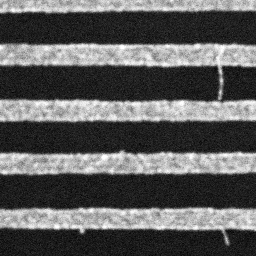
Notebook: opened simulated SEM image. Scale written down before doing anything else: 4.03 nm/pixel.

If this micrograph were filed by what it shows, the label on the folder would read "lines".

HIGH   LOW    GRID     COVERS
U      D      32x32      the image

UUUUUUUUUUUUUUUUUUUUUUUUUUUUUUUU
DDDDDDDDDDDDDDDDDDDDDDDDDDDDDDDD
DDDDDDDDDDDDDDDDDDDDDDDDDDDDDDDD
DDDDDDDDDDDDDDDDDDDDDDDDDDDDDDDD
DDDDDDDDDDDDDDDDDDDDDDDDDDDDDDDD
DDDDDDDDDDDDDDDDDDDDDDDDDDDDDDDD
UUUUUUUUUUUUUUUUUUUUUUUUUUUUUUUU
UUUUUUUUUUUUUUUUUUUUUUUUUUUUUUUU
DDDDDDDDDDDDDDDDDDDDDDDDDDDDDDDD
DDDDDDDDDDDDDDDDDDDDDDDDDDDDDDDD
DDDDDDDDDDDDDDDDDDDDDDDDDDDDDDDD
DDDDDDDDDDDDDDDDDDDDDDDDDDDDDDDD
DDDDDDDDDDDDDDDDDDDDDDDDDDDDDDDD
UUUUUUUUUUUUUUUUUUUUUUUUUUUUUUUU
UUUUUUUUUUUUUUUUUUUUUUUUUUUUUUUU
DDDDDDDDDDDDDDDDDDDDDDDDDDDDDDDD
DDDDDDDDDDDDDDDDDDDDDDDDDDDDDDDD
DDDDDDDDDDDDDDDDDDDDDDDDDDDDDDDD
DDDDDDDDDDDDDDDDDDDDDDDDDDDDDDDD
UUUUDUUUUUUUUUUUUUUUUUUUUUUUUUUU
UUUUUUUUUUUUUUUUUUUUUUUUUUUUUUUU
DDDDDDDDDDDDDDDDDDDDDDDDDDDDDDDD
DDDDDDDDDDDDDDDDDDDDDDDDDDDDDDDD
DDDDDDDDDDDDDDDDDDDDDDDDDDDDDDDD
DDDDDDDDDDDDDDDDDDDDDDDDDDDDDDDD
DDDDDDDDDDDDDDDDDDDDDDDDDDDDDDDD
UUUUUUUDUUUUUUUUUUUUUUUUUUUUUUUU
UUUUUUUUUUUUUUUUUUUUUUUUUUUUUUUU
DDDDDDDDDDUUUDDDDDDUUUUUUUUUUDUU
DDDDDDDDDDDDDDDDDDDDDDDDDDDDDDDD
DDDDDDDDDDDDDDDDDDDDDDDDDDDDDDDD
DDDDDDDDDDDDDDDDDDDDDDDDDDDDDDDD